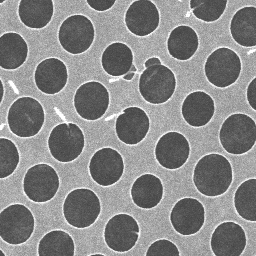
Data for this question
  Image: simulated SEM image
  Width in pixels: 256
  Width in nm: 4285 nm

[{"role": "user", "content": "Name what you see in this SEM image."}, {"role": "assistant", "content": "a regular array of holes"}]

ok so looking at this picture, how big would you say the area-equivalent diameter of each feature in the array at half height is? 609 nm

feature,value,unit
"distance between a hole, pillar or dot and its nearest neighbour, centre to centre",790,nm